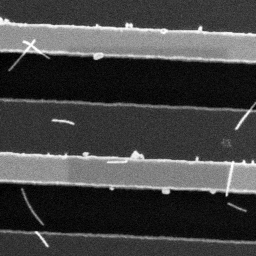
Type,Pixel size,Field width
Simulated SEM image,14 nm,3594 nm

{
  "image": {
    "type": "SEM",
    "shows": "lines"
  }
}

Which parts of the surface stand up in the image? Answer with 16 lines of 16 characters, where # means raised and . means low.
################
################
################
......##########
................
................
######..........
################
################
################
################
....############
................
................
#...............
################